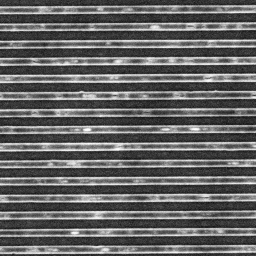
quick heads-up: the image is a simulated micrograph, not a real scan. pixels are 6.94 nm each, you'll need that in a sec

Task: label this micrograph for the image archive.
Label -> parallel lines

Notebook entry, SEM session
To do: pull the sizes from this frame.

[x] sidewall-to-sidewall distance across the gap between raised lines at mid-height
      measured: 69.4 nm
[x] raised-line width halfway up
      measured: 50.3 nm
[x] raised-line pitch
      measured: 119 nanometres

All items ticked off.